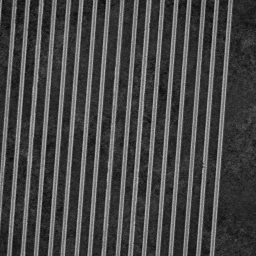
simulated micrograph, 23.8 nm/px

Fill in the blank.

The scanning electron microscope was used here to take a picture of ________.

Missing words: parallel lines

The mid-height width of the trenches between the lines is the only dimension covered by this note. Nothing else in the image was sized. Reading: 246 nm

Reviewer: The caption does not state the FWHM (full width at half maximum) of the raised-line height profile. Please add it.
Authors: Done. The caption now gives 80.1 nanometres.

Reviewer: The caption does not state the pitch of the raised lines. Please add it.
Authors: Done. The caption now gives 320 nanometres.